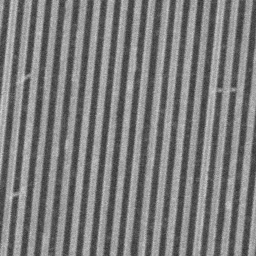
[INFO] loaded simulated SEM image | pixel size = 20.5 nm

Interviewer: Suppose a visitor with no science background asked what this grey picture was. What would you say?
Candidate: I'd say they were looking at parallel lines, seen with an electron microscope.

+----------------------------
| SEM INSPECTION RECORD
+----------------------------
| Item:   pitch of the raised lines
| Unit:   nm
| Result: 282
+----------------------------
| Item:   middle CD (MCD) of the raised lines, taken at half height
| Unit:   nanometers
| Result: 112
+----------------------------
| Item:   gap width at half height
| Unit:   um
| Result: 0.166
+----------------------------